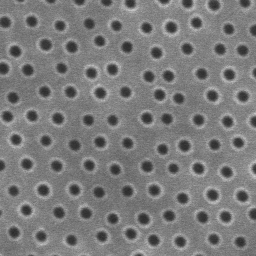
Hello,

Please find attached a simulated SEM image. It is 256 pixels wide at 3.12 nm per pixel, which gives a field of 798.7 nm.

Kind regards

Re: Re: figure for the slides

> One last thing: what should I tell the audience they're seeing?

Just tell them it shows a regular array of holes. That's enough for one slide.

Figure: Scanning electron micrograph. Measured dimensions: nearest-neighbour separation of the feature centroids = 75.3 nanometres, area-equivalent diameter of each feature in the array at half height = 39.6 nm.